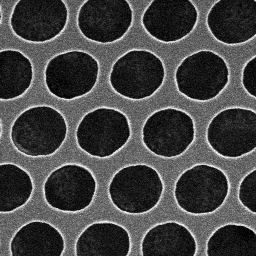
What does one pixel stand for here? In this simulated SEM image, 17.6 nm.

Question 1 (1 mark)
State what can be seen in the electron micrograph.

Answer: a regular array of holes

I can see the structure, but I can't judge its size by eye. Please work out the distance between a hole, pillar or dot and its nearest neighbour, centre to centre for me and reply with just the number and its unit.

1.14 um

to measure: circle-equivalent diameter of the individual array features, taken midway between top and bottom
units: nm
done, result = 888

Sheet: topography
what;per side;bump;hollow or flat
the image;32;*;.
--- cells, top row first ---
**......**......***.....***.....
**......**......**.......*......
*.......**......**.......*......
**......**......**......**......
**.....****....****....****.....
********************************
..*******.******...******.******
...***......***.....***.....***.
....**......**......**......***.
....**......**......**.......*..
....**......**......**......**..
...***.....****....****....****.
*************************.******
****..**************************
**......***.....***.....***.....
**......**......**......**......
*.......**......**......**......
**......**......**......**......
**.....***.....***.....****.....
************..******..******..**
********************************
...****....****.....***.....***.
....**......**......**......**..
....**......**......**......**..
....**......**......**......**..
...***.....***.....***......**..
.***************..******..******
********************************
***....****....****....*****...*
**......**......**......**......
*.......**......**......**......
*.......*.......**......**......